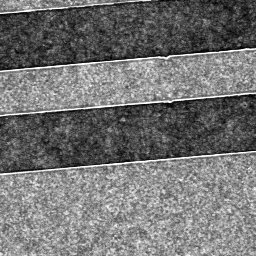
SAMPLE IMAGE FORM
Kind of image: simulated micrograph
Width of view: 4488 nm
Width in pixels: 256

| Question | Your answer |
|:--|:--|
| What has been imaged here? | one or a few lines or trenches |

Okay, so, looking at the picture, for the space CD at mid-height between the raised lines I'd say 1.02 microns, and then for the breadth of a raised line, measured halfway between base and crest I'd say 45.1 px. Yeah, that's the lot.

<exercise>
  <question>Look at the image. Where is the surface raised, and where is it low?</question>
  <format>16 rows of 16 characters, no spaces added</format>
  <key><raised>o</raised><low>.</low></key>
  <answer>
oooo............
................
................
...........ooooo
oooooooooooooooo
oooooooooooooooo
ooooooooo.......
................
................
................
....oooooooooooo
oooooooooooooooo
oooooooooooooooo
oooooooooooooooo
oooooooooooooooo
oooooooooooooooo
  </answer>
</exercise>